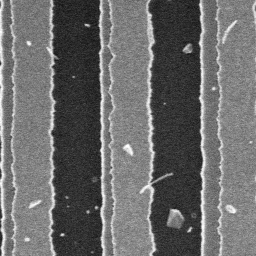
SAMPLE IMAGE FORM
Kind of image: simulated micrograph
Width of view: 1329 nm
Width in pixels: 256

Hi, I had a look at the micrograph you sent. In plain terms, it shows lines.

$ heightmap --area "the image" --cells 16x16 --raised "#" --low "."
###...###....###
###...####...###
###...####...###
###...###....###
###...###....###
###...###....###
###...###....###
###...###....###
###...###....###
###...###....###
###...###....###
###...###....###
###...###....###
###...###....###
###...###....###
###...####...###